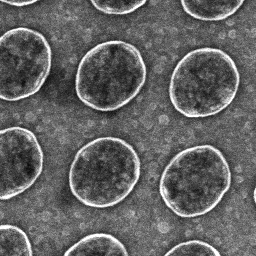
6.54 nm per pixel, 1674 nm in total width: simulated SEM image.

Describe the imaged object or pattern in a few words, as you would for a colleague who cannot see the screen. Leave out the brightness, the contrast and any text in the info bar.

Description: raised bodies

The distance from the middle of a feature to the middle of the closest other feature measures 607 nm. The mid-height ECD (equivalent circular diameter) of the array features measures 446 nm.